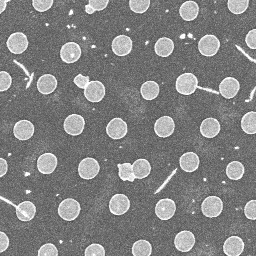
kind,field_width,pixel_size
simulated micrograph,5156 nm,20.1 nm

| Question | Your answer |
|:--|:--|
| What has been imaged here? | a regular array of raised bodies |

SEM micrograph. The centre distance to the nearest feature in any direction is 806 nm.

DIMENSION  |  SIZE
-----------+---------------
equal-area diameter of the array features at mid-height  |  408 nanometers